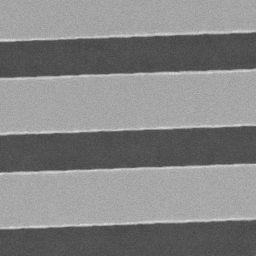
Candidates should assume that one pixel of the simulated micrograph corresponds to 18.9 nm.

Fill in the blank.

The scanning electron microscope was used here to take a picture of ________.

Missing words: lines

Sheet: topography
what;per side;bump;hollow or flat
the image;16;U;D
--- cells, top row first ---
UUUUUUUUUUUUUUUU
UUUUUUUUUUUUUUUU
UUDDDDDDDDDDDDDD
DDDDDDDDDDDDDDDD
DDDDDDDDDDDDUUUU
UUUUUUUUUUUUUUUU
UUUUUUUUUUUUUUUU
UUUUUUUUUUUUUUUU
DDDDDDDDDDDDDDDD
DDDDDDDDDDDDDDDD
DDDDDDDDDUUUUUUU
UUUUUUUUUUUUUUUU
UUUUUUUUUUUUUUUU
UUUUUUUUUUUUUUUU
DDDDDDDDDDDDDDDD
DDDDDDDDDDDDDDDD